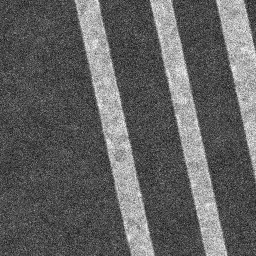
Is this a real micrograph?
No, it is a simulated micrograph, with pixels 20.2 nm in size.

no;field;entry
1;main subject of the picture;one or a few lines or trenches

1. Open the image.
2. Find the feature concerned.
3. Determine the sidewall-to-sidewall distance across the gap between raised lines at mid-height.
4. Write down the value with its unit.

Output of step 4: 1040 nm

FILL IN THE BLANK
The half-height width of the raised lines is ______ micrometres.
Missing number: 0.439